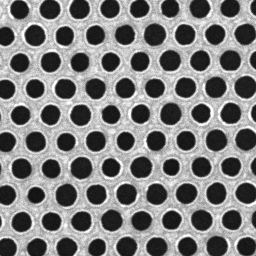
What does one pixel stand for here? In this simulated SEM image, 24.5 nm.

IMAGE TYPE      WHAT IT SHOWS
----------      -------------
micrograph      a regular array of holes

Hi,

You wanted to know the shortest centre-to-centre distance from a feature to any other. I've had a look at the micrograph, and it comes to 29.9 pixels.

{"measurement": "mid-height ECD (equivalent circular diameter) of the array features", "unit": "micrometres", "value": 0.512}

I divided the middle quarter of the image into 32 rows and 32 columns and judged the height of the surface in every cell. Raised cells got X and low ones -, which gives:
XX----XXX-----XXX----XXX-----XXX
XX----XXXX---XXXX---XXXXX---XXXX
XXXXXXXXXXXXXXXXXXXXXXXXXXXXXXXX
XXXXXXX--XXXXXX-XXXXXXXXXXXXX--X
--XXXX----XXX----XXXX----XXX----
---XX------XX-----XX-----XXX----
---XX------XX-----XX-----XXX----
---XXX----XXX-----XXX----XXX----
--XXXXX--XXXXX--XXXXXX--XXXXXX-X
XXXXXXXXXXXXXXXXXXXXXXXXXXXXXXXX
XX----XXXXX--XXXXX---XXXX----XXX
XX-----XXX----XXX----XXX-----XXX
XX-----XX-----XXX-----XX-----XXX
XX-----XX-----XXX----XXX-----XXX
XX----XXXX---XXXX----XXX-----XXX
XXX--XXXXXXXXXXXXXXXXXXXXX-XXXXX
XXXXXXXXXXXXXXXXXXXXXXXXXXXXXXXX
--XXXX----XXXX---XXXX----XXXX---
---XX-----XXX-----XXX-----XX----
---XX------XX-----XX------XX----
---XXX----XXX----XXXX----XXX----
--XXXX---XXXXX--XXXXXX--XXXXXX-X
XXXXXXXXXXXXXXXXXXXXXXXXXXXXXXXX
XXX---XXXXX-XXXXXX---XXXXXXXXXXX
XX-----XXX----XXX-----XXX----XXX
X------XX-----XX------XXX----XXX
X------XX-----XX------XXX----XXX
XX-----XXX----XXX-----XXX---XXXX
XXX---XXXXXXXXXXXX--XXXXXXXXXXXX
XXXXXXXXXXXXXXXXXXXXXXXXXXXXXXXX
--XXXX----XXXX---XXXX----XXXX---
---XXX-----XX-----XXX-----XX----